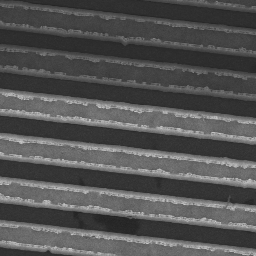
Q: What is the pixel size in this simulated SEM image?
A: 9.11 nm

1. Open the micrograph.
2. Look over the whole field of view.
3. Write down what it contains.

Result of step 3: parallel lines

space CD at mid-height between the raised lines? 180 nm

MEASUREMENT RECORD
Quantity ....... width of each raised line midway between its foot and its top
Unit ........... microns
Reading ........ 0.212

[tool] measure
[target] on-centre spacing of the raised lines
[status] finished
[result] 0.397 microns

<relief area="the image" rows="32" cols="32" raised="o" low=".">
ooo.....................oooooooo
ooooooooooo.....................
oooooooooooooooooooo............
..ooooooooooooooooooooooooooo...
..........oooooooooooooooooooooo
...................ooooooooooooo
ooooooo.....................oooo
oooooooooooooooo................
oooooooooooooooooooooooo........
......oooooooooooooooooooooooooo
...............ooooooooooooooooo
o.......................oooooooo
oooooooooo......................
ooooooooooooooooooo.............
...ooooooooooooooooooooooooo....
...........ooooooooooooooooooooo
....................oooooooooooo
oooooo.......................ooo
oooooooooooooooo................
ooooooooooooooooooooooo.........
........oooooooooooooooooooooooo
................oooooooooooooooo
o........................ooooooo
oooooooooo......................
ooooooooooooooooooo.............
...ooooooooooooooooooooooooo....
............oooooooooooooooooooo
.....................ooooooooooo
ooooooo.......................oo
oooooooooooooooo................
oooooooooooooooooooooooo........
.......ooooooooooooooooooooooooo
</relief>